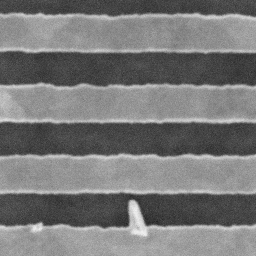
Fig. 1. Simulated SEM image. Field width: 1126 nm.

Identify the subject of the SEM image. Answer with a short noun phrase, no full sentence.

lines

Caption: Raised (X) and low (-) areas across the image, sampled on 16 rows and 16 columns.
----------------
XXXXXXXXXXXXXXXX
XXXXXXXXXXXXXXXX
----------------
----------------
XXXXXXXXXXXXXXXX
XXXXXXXXXXXXXXXX
XXXXXXXXXXXXXXXX
----------------
----------------
XXXXXXXXXXXXXXXX
XXXXXXXXXXXXXXXX
----------------
--------X-------
XXXXXXXXXXXXXXXX
XXXXXXXXXXXXXXXX